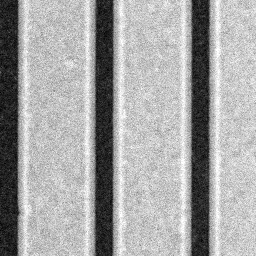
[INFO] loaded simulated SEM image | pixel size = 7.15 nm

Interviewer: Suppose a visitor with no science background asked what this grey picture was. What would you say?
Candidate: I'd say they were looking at one or a few lines or trenches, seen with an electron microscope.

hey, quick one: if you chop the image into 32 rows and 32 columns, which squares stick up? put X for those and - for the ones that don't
---XXXXXXXX----XXXXXXXX----XXXXX
---XXXXXXXX----XXXXXXXX----XXXXX
---XXXXXXXX----XXXXXXXX----XXXXX
---XXXXXXXX----XXXXXXXX----XXXXX
---XXXXXXXX----XXXXXXXX----XXXXX
---XXXXXXXX----XXXXXXXX----XXXXX
---XXXXXXXX----XXXXXXXX----XXXXX
---XXXXXXXX----XXXXXXXX----XXXXX
---XXXXXXXX----XXXXXXXX----XXXXX
---XXXXXXXX----XXXXXXXX----XXXXX
---XXXXXXXX----XXXXXXXX----XXXXX
---XXXXXXXX----XXXXXXXX----XXXXX
---XXXXXXXX----XXXXXXXX----XXXXX
---XXXXXXXX----XXXXXXXX----XXXXX
---XXXXXXXX----XXXXXXXX----XXXXX
---XXXXXXXX----XXXXXXXX----XXXXX
---XXXXXXXX----XXXXXXXX----XXXXX
---XXXXXXXX----XXXXXXXX----XXXXX
---XXXXXXXX----XXXXXXXX----XXXXX
---XXXXXXXX----XXXXXXXX----XXXXX
---XXXXXXXX----XXXXXXXX----XXXXX
---XXXXXXXX----XXXXXXXX----XXXXX
---XXXXXXXX----XXXXXXXX----XXXXX
---XXXXXXXX----XXXXXXXX----XXXXX
---XXXXXXXX----XXXXXXXX----XXXXX
---XXXXXXXX----XXXXXXXX----XXXXX
---XXXXXXXX----XXXXXXXX----XXXXX
---XXXXXXXX----XXXXXXXX----XXXXX
---XXXXXXXX----XXXXXXXX----XXXXX
---XXXXXXXX----XXXXXXXX----XXXXX
---XXXXXXXX----XXXXXXXX----XXXXX
---XXXXXXXX----XXXXXXXX----XXXXX